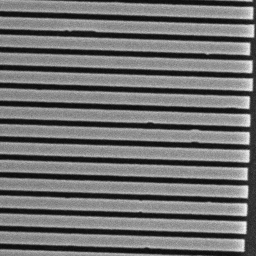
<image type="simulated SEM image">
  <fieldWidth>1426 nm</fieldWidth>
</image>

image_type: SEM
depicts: parallel lines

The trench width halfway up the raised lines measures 29.2 nanometers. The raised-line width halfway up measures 67.5 nanometers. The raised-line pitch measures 99.5 nanometres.